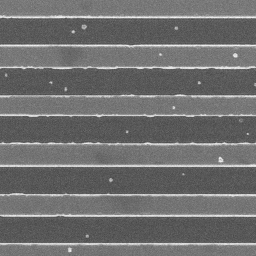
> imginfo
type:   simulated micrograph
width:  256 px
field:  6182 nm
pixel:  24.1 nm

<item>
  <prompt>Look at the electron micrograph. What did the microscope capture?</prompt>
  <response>lines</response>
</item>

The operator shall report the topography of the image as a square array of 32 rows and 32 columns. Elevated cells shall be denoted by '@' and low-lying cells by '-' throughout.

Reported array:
@@@@@@@@@@@@@@@@@@@@@@@@@@@@@@@@
@@@@@@@@@@@@@@@@@@@@@@@@@@@@@@@@
--------------------------------
--------------------------------
--------------------------------
--------------------------------
@@@@@@@@@@@@@@@@@@@@@@@@@@@@@@@@
@@@@@@@@@@@@@@@@@@@@@@@@@@@@@@@@
------@@@---@@@--@--@@-@@@-@@@@-
--------------------------------
--------------------------------
--------------------------------
@@@@@@@@@@@@@@@@@@@@@@@@@@@@@@@@
@@@@@@@@@@@@@@@@@@@@@@@@@@@@@@@@
------------@-----@@---@@--@----
--------------------------------
--------------------------------
--------------------------------
@@@@@@@@@@@@@@@@@@@@@@@@@@@@@@@@
@@@@@@@@@@@@@@@@@@@@@@@@@@@@@@@@
@@@@@@@@@@@@@@@@@@@@@@@@@@@@@@@@
--------------------------------
--------------------------------
--------------------------------
@@@@@@@@@@@@@@@@@@@@@@@@@@@@@@@@
@@@@@@@@@@@@@@@@@@@@@@@@@@@@@@@@
@@@@@@@@@@@@@@@@@@@@@@@@@@@@@@@@
--------------------------------
--------------------------------
--------------------------------
@@@@@@@@@@@@@@@@@@@@@@@@@@@@@@@@
@@@@@@@@@@@@@@@@@@@@@@@@@@@@@@@@